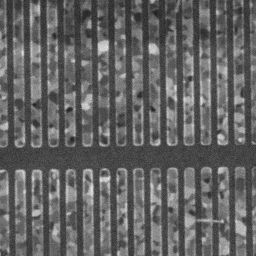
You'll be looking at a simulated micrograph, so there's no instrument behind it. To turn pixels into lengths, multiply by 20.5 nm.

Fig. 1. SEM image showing groups of lines, slits or small figures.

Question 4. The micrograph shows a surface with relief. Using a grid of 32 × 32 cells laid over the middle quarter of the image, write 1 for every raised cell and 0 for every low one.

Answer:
11000110011001100110011100110011
11000110011001100110011100110011
11000110011001100111011100110011
11000110011001100111011100110011
11100110011001100111011100110011
11100110011001100111011100110011
11100110011001100111011100110011
11100110011001100111011100110011
11100110011001100111011100110011
11100110011001100111001100110011
11100110011001100111001100110011
11100110011001100111001100110011
11100110011001100111001100110011
11100110011001100111001100110011
01100110011001100111001100110011
01100110011001100011001100110011
01100110011001100011001100110011
01100110011001100011001100110011
01100110011001100011001100110011
01100110011001100011001100110011
00000000000000000000000000000000
00000000000000000000000000000000
00000000000000000000000000000000
00000000000000000000000000000000
00000000000000000000000000000000
00000000000000000000000000000000
00000000001000100010001100110011
01100110011001100011001100110011
01100110011001100011001100110011
01100110011000100011001100110011
01100110011000100011001100110011
01100110011000100011001100110011